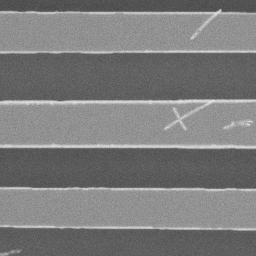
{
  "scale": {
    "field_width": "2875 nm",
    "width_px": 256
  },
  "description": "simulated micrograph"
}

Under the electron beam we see lines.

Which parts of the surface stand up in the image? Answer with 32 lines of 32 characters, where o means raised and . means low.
................................
oo.oo...oo.................o....
oooooooooooooooooooooooooooooooo
oooooooooooooooooooooooooooooooo
oooooooooooooooooooooooooooooooo
oooooooooooooooooooooooooooooooo
ooo.o.o...oooo..................
................................
................................
................................
................................
................................
................................
oooooooooooooooooooooooooooooooo
oooooooooooooooooooooooooooooooo
oooooooooooooooooooooooooooooooo
oooooooooooooooooooooooooooooooo
oooooooooooooooooooooooooooooooo
.......................ooooooooo
................................
................................
................................
................................
oooo.....o.oo...................
oooooooooooooooooooooooooooooooo
oooooooooooooooooooooooooooooooo
oooooooooooooooooooooooooooooooo
oooooooooooooooooooooooooooooooo
..........oooooooooooooooooooooo
................................
................................
................................